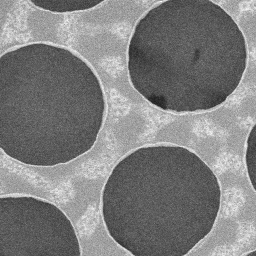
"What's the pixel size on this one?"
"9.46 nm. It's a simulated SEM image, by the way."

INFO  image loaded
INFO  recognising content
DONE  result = holes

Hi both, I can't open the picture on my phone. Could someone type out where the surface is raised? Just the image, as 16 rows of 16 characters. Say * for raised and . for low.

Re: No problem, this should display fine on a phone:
***...****....**
*********......*
********.......*
.....***.......*
......**.......*
......**.......*
.......***....**
......**********
......**********
.....***....***.
*******......**.
*******.......**
...***........**
....**........**
.....**......***
.....***....****